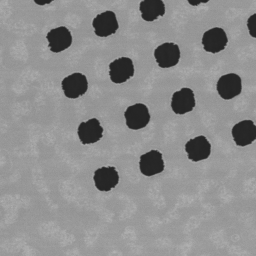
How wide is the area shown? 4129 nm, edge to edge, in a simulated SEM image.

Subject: a regular array of holes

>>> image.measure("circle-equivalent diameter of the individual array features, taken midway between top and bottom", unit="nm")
410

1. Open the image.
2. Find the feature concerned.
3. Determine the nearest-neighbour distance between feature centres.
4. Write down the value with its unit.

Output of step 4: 781 nanometers